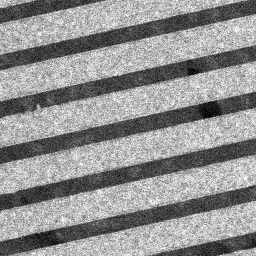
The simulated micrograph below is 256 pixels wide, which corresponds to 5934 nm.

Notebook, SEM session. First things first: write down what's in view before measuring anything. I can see parallel lines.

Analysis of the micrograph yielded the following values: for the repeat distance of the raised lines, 1060 nanometres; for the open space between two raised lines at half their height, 382 nanometers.